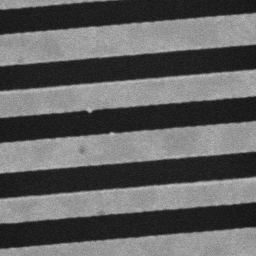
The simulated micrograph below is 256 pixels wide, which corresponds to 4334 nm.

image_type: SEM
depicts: lines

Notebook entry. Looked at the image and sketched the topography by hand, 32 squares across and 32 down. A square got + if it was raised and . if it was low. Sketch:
++++++++........................
................................
......................++++++++++
...........+++++++++++++++++++++
++++++++++++++++++++++++++++++++
++++++++++++++++++++++++++++++++
++++++++++++++++++++............
+++++++++.......................
................................
......................++++++++++
............++++++++++++++++++++
++++++++++++++++++++++++++++++++
++++++++++++++++++++++++++......
+++++++++++++...................
+++.............................
............................++++
................++++++++++++++++
.....+++++++++++++++++++++++++++
++++++++++++++++++++++++++++++++
+++++++++++++++++++++++++.......
+++++++++++++...................
++..............................
............................++++
................++++++++++++++++
......++++++++++++++++++++++++++
+++++++++++++++++++++++++++++...
+++++++++++++++++...............
+++++...........................
................................
...................+++++++++++++
.......+++++++++++++++++++++++++
++++++++++++++++++++++++++++++++